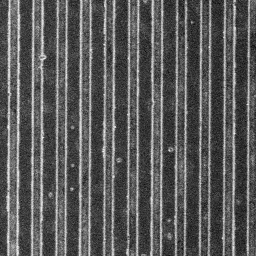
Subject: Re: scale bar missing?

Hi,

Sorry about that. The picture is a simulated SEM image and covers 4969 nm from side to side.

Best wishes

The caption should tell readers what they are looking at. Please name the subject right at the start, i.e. parallel lines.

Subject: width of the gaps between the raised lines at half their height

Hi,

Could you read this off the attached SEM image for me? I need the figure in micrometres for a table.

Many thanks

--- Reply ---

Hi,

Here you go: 0.167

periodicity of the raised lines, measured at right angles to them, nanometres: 465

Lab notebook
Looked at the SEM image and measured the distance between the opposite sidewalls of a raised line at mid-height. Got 15.2 px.